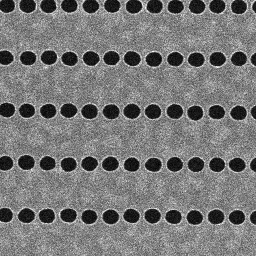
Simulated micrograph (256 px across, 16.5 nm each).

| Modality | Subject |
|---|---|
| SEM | a regular array of holes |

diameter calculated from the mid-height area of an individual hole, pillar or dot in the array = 260 nanometres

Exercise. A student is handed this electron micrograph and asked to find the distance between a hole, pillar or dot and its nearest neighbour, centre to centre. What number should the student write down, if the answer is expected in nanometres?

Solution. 345